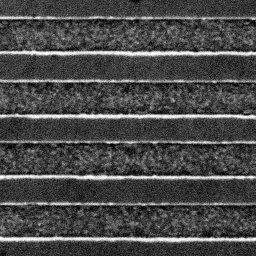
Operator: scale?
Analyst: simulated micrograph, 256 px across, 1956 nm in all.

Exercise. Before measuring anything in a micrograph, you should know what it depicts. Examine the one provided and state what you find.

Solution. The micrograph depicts lines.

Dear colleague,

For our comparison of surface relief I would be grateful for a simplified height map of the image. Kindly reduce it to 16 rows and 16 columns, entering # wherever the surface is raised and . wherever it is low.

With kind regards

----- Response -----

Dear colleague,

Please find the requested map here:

################
................
................
################
################
................
................
################
################
................
................
################
################
................
................
################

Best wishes